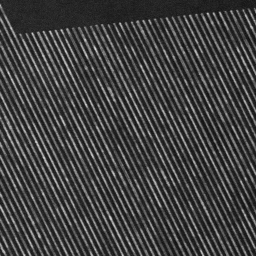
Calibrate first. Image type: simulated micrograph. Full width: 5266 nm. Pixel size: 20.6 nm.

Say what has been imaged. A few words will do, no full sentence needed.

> parallel lines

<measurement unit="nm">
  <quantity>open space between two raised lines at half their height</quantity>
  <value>80.8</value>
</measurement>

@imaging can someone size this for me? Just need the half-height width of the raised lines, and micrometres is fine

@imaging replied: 0.03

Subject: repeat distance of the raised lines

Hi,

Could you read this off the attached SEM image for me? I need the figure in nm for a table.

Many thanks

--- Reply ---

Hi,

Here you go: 114